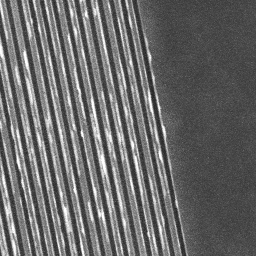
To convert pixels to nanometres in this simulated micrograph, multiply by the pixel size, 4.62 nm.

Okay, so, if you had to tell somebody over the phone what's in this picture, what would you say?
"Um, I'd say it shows parallel lines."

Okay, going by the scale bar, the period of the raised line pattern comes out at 52.4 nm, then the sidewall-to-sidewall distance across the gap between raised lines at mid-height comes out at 22.2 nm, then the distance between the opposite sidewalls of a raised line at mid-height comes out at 26.7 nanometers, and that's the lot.